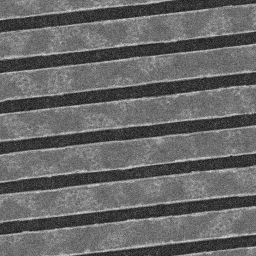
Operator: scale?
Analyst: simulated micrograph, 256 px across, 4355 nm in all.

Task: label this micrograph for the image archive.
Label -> parallel lines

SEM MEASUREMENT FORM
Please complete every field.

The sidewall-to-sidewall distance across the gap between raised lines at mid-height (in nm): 234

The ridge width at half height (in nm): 452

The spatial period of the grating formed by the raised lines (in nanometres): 685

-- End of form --